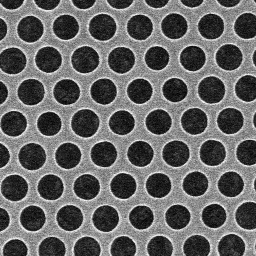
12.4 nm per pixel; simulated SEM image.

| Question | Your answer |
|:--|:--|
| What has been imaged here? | a regular array of holes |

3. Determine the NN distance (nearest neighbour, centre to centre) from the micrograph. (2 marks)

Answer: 444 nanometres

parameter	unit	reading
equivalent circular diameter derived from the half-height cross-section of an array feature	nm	332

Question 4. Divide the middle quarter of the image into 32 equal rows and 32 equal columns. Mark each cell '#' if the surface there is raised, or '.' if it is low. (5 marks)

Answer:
##.......##......####.....###...
###.....####....######..#######.
##############.#################
#########..################.####
...#####....#####....####.....##
....###......###......###......#
....##.......###......##.......#
....##.......###......###......#
....###......###......###.....##
...#####....#####....######..###
################################
####...#######.########..######.
###.....####.....####.....####..
##.......##......####......##...
##.......##.......##.......##...
##.......##.......###......##...
##.......###.....####.....####..
###.....#####...#######..######.
#####.##########################
.########..######....#####....##
...####......###......###......#
....###......###......###......#
....###......###.......#........
....###......###......###......#
....###......####.....###......#
...######...######...######..###
################################
#####.#######...######...######.
###.....####.....####.....####..
##.......###......###......###..
##.......##.......##.......##...
##.......###......###......###..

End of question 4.